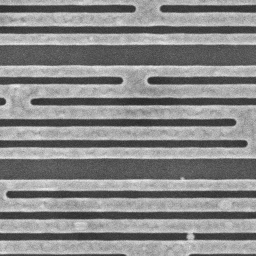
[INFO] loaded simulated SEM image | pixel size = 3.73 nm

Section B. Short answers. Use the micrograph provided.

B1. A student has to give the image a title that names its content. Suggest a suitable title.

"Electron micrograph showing groups of lines, slits or small figures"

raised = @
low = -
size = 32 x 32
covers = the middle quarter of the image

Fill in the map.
-@@@----------------------------
@@@@@@@@@@@@@@@@@@@@@@@@@@@@@@@@
@@@@@@@@@@@@@@@@@@@@@@@@@@@@@@@@
--------------@@@@@@@-----------
---------------@@@@@@-----------
@@@@@@@@@@@@@@@@@@@@@@@@@@@@@@@@
@@@@@@@@@@@@@@@@@@@@@@@@@@@@@@@@
@@@@@@@@@@@@@@@@@@@@@@@@@@@@@@@@
--------------------------------
--------------------------------
--------------------------------
@@@@@@@@@@@@@@@@@@@@@@@@@@@@@@@@
@@@@@@@@@@@@@@@@@@@@@@@@@@@@@@@@
---@@@@@@@@@@@--@@@--@@@@@@@---@
--------------------------------
--------------------------------
@@@@@@@@@@@@@@@@@@@@@@@@@@@@@@@@
@@@@@@@@@@@@@@@@@@@@@@@@@@@@@@@@
@@@@@@@@@@@@@@@@@@@@@@@@@@@@@@@@
--------------------------------
--------------------------------
@@@@@@@@@@@@@@@@@@@@@@@@@@@@@@@@
@@@@@@@@@@@@@@@@@@@@@@@@@@@@@@@@
-@@@@@-------------@@@@@@@@--@@@
--------------------------------
--------------------------------
--------------------------------
--------------------------------
--------------------------------
@@@@@@@@@@@@@@@@@@@@@@@@@@@@@@@@
@@@@@@@@@@@@@@@@@@@@@@@@@@@@@@@@
--------------------------------